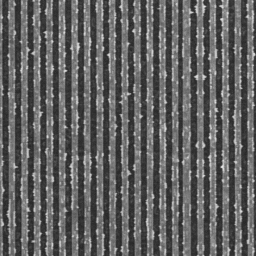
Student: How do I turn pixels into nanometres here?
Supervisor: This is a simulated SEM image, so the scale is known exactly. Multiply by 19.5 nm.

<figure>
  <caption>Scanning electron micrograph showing parallel lines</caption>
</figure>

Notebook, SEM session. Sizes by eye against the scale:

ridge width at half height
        114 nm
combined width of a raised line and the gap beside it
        12.6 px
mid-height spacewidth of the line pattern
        127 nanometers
